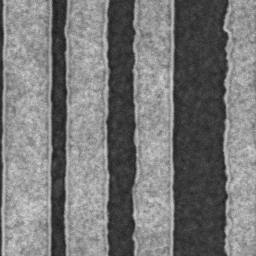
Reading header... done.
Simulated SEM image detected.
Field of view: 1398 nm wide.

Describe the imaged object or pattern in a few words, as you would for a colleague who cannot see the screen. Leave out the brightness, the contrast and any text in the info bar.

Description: one or a few lines or trenches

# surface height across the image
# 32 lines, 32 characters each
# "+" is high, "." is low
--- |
.+++++...++++....+++++.......+++
++++++...++++....+++++.......+++
.+++++..+++++....+++++......++++
.+++++..+++++....+++++......++++
.+++++..+++++....+++++.......+++
.+++++..+++++....+++++.......+++
++++++..+++++....++++........+++
++++++..+++++....++++........+++
.+++++..+++++....++++........+++
.+++++..+++++....++++........+++
.+++++..+++++....++++.......++++
.+++++...++++....++++.......++++
.+++++...++++....++++.......++++
.+++++...++++....+++++......++++
.+++++...++++....++++.......++++
.+++++..+++++....++++........+++
.+++++..+++++....++++.......++++
++++++..+++++....++++.......++++
++++++...++++....++++.......++++
++++++...++++....++++.......++++
.+++++..+++++....++++.......++++
.+++++..+++++....+++++......++++
.+++++..++++++...++++........+++
.+++++..+++++....++++.......++++
.+++++..+++++....++++.......++++
++++++..+++++....+++++......++++
++++++..+++++....+++++......++++
++++++..+++++....+++++.......+++
++++++..+++++....+++++.......+++
++++++..+++++....++++.......++++
++++++..+++++....+++++......++++
++++++..+++++....++++.......++++